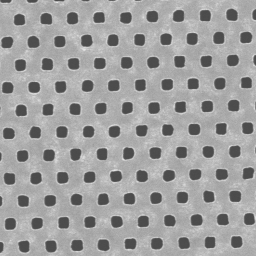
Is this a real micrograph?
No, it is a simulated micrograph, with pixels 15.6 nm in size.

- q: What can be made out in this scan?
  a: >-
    a regular array of holes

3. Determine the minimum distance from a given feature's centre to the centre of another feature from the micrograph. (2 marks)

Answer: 406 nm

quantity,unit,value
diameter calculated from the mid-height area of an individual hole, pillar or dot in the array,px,12.4